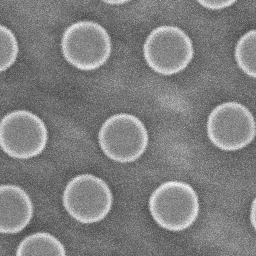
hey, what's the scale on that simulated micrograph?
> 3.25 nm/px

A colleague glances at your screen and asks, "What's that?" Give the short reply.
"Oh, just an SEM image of raised bodies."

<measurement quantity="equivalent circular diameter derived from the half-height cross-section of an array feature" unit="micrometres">0.153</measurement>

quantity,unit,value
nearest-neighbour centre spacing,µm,0.266